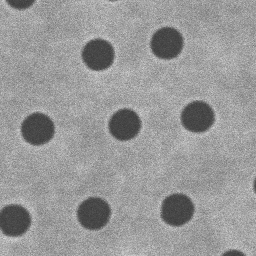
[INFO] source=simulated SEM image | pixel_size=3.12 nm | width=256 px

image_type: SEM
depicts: holes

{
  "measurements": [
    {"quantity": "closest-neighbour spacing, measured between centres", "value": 229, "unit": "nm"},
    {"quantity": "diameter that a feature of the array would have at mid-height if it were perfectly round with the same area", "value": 102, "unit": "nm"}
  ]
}